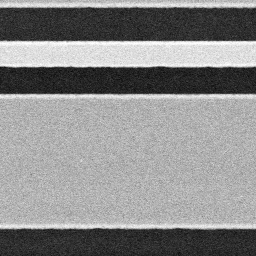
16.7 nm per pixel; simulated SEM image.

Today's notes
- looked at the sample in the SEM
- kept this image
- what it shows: lines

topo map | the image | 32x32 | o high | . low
oooooooooooooooooooooooooooooooo
................................
................................
................................
................................
oooooooooooooooooooooooooooooooo
oooooooooooooooooooooooooooooooo
oooooooooooooooooooooooooooooooo
................................
................................
................................
................................
oooooooooooooooooooooooooooooooo
oooooooooooooooooooooooooooooooo
oooooooooooooooooooooooooooooooo
oooooooooooooooooooooooooooooooo
oooooooooooooooooooooooooooooooo
oooooooooooooooooooooooooooooooo
oooooooooooooooooooooooooooooooo
oooooooooooooooooooooooooooooooo
oooooooooooooooooooooooooooooooo
oooooooooooooooooooooooooooooooo
oooooooooooooooooooooooooooooooo
oooooooooooooooooooooooooooooooo
oooooooooooooooooooooooooooooooo
oooooooooooooooooooooooooooooooo
oooooooooooooooooooooooooooooooo
oooooooooooooooooooooooooooooooo
ooooooooooooo..oooo.oo..oooooooo
................................
................................
................................